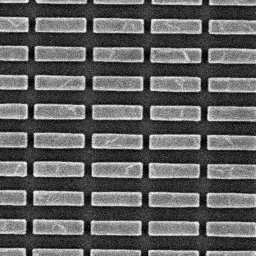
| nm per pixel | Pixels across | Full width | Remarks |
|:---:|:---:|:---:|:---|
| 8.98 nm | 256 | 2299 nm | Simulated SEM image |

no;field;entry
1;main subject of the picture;wiring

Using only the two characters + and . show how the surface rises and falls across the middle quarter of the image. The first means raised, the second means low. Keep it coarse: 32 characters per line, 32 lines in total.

................................
................................
................................
+++++...+++++++++++...+++++++++.
+++++..+++++++++++++..++++++++++
+++++..+++++++++++++..++++++++++
.......................+++++++++
................................
................................
................................
+++++..++++++++++++.............
+++++..+++++++++++++..++++++++++
+++++..+++++++++++++..++++++++++
+++++..++++++++++++...++++++++++
................................
................................
................................
++..............................
+++++..+++++++++++++.+++++++++++
+++++..+++++++++++++.+++++++++++
+++++..+++++++++++++.+++++++++++
................................
................................
................................
................................
+++++..+++++++++++++.+++++++++++
+++++..+++++++++++++.+++++++++++
+++++..+++++++++++++.+++++++++++
................................
................................
................................
................................